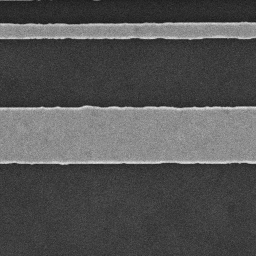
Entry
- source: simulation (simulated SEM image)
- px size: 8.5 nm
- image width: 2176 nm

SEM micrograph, lines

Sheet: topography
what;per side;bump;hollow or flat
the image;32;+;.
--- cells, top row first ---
................................
................................
................................
++++++++++++++++++++++++++++++++
++++++++++++++++++++++++++++++++
................................
................................
................................
................................
................................
................................
................................
................................
.......+..+++++++.+++....+++++++
++++++++++++++++++++++++++++++++
++++++++++++++++++++++++++++++++
++++++++++++++++++++++++++++++++
++++++++++++++++++++++++++++++++
++++++++++++++++++++++++++++++++
++++++++++++++++++++++++++++++++
.......++.......................
................................
................................
................................
................................
................................
................................
................................
................................
................................
................................
................................